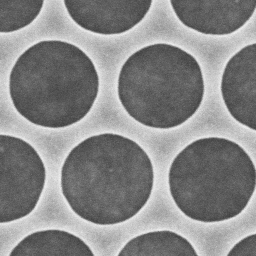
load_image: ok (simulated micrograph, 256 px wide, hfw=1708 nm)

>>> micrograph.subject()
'holes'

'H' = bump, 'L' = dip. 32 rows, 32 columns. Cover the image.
LLLLLHHHLLLLLLLLLLLHHLLLLLLLLLLL
LLLLLHHHLLLLLLLLLLHHHHLLLLLLLLLL
LLLLHHHHHLLLLLLLLLHHHHLLLLLLLLLH
LLLHHHHHHHLLLLLLLHHHHHHHLLLLLLHH
HHHHHHHHHHHHHHHHHHHHHHHHHHHHHHHH
HHHHLLLLLHHHHHHHHHHLLHHHHHHHHHHL
HHHLLLLLLLHHHHHHHLLLLLLHHHHHHHLL
HHLLLLLLLLLHHHHHLLLLLLLLLHHHHLLL
HHLLLLLLLLLLHHHLLLLLLLLLLHHHLLLL
HLLLLLLLLLLLHHHLLLLLLLLLLHHHLLLL
HLLLLLLLLLLLHHHLLLLLLLLLLLHHLLLL
HLLLLLLLLLLLHHHLLLLLLLLLLLHHLLLL
HLLLLLLLLLLLHHHLLLLLLLLLLHHHLLLL
HHLLLLLLLLLHHHHLLLLLLLLLLHHHLLLL
HHHLLLLLLLLHHHHHLLLLLLLLHHHHHLLL
HHHHLLLLLHHHHHHHHHLLLLLHHHHHHHLL
HHHHHHHHHHHHHHHHHHHHHHHHHHHHHHHH
LLLHHHHHHHHLLLLLLHHHHHHHHLLLLHHH
LLLLHHHHHLLLLLLLLLHHHHHLLLLLLLHH
LLLLLHHHLLLLLLLLLLLHHHLLLLLLLLLH
LLLLLHHHLLLLLLLLLLLHHLLLLLLLLLLL
LLLLLLHHLLLLLLLLLLLHHLLLLLLLLLLL
LLLLLLHHLLLLLLLLLLLHHLLLLLLLLLLL
LLLLLHHHLLLLLLLLLLLHHLLLLLLLLLLL
LLLLLHHHLLLLLLLLLLLHHLLLLLLLLLLL
LLLLLHHHHLLLLLLLLLHHHHLLLLLLLLLH
LLLLHHHHHLLLLLLLLHHHHHHLLLLLLLHH
LLHHHHHHHHHLLLLLHHHHHHHHLLLLHHHH
HHHHHHHHHHHHHHHHHHHHHHHHHHHHHHHH
HHHLLLLLLLHHHHHHHLLLLLLHHHHHHHHL
HHLLLLLLLLLHHHHHLLLLLLLLHHHHHLLL
HLLLLLLLLLLLHHHLLLLLLLLLLHHHHLLL